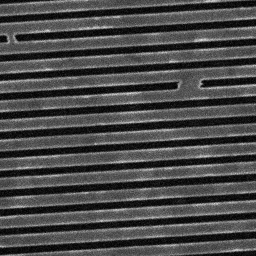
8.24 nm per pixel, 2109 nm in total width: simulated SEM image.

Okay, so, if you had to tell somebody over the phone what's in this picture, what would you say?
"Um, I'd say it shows parallel lines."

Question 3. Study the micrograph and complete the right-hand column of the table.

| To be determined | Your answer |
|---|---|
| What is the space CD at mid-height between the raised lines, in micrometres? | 0.0647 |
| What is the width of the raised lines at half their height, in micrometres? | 0.0925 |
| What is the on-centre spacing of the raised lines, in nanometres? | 159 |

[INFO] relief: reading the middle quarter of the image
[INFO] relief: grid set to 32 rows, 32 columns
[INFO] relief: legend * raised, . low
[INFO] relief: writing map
************....................
..............................**
..............******************
********************************
************************.....***
********.....................***
............................****
...........*********************
********************************
********************............
****............................
.........................*******
..........**********************
********************************
*******************.............
****............................
.........................*******
.........***********************
********************************
*******************.............
***.............................
.....................***********
......**************************
******************************..
***************.................
................................
.................***************
..******************************
***************************.....
***********.....................
................................
.................***************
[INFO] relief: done